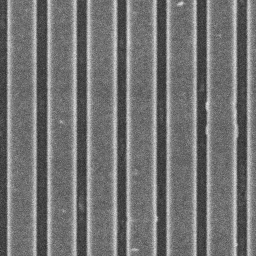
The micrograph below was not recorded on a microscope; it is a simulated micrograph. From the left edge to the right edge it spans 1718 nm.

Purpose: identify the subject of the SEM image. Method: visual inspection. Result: parallel lines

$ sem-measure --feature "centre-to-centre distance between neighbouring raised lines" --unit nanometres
267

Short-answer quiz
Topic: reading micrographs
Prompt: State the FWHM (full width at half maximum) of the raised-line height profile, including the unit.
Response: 195 nm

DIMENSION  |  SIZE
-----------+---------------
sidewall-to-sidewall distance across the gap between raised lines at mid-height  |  0.0713 um